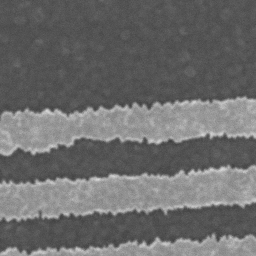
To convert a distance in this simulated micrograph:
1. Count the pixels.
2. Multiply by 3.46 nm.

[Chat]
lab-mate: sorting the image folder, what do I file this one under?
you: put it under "one or a few lines or trenches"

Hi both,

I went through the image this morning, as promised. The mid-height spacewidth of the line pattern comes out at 117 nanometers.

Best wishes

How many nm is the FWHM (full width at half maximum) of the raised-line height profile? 117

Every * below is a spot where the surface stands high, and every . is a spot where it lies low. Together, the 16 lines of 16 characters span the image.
................
................
................
................
................
................
...........*****
****************
*************...
*.*.............
................
****************
****************
**.*............
................
......**********